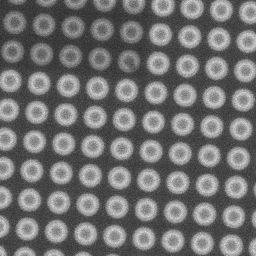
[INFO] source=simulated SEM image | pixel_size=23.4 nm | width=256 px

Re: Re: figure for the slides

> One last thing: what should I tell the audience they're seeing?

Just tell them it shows an array of small figures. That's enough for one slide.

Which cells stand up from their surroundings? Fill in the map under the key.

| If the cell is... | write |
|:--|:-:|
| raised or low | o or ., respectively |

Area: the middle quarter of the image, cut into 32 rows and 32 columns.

ooo....oooo...ooooo..ooooo..oooo
..............oooo...ooooo..oooo
.......................oo....ooo
ooo....oo.......................
oooo..ooooo...ooo...............
oooo..ooooo..ooooo...oooo....ooo
oooo..ooooo..ooooo..oooooo..oooo
ooo...ooooo..ooooo..oooooo..oooo
.......ooo....oooo...oooo...oooo
......................oo....oooo
oo............................o.
ooo...oooo....ooo...............
ooo..ooooo...oooo....ooo.....oo.
ooo..ooooo..oooooo..ooooo..ooooo
ooo..ooooo..oooooo..ooooo..ooooo
......oooo...oooo...ooooo..ooooo
..............oo....oooo...ooooo
o...........................ooo.
oo...oooo.....o.................
ooo..ooooo..ooooo...ooo.........
ooo.oooooo..ooooo..ooooo...oooo.
oo..oooooo..ooooo..ooooo..oooooo
o....oooo...ooooo..ooooo..oooooo
.............ooo....oooo...ooooo
.....................oo....oooo.
o....ooo........................
oo..ooooo...oooo....oo..........
oo..ooooo..ooooo...oooo....ooo..
oo..ooooo..oooooo.oooooo..ooooo.
o...ooooo..ooooo..oooooo..ooooo.
......oo....oooo...ooooo..ooooo.
....................oo....ooooo.